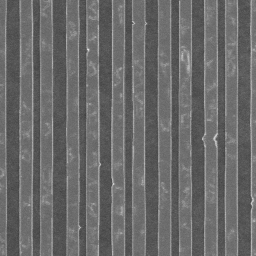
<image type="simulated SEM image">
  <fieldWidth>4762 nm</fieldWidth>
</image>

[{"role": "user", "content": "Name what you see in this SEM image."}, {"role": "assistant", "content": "parallel lines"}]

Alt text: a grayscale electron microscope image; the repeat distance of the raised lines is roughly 424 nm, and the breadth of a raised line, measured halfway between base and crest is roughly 228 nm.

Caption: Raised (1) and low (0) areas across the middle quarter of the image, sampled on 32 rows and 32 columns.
01110011100011100111000011100111
01110011100011100111000011100111
01110011100011100111000011100111
01110011100011100111000011100111
01110011100011100111000011100111
01110011100011100111000011100111
01110011100011100111000011100111
01110011100011100111000011100111
01110011100011100111000011100111
01110011100011100111000011100111
01110011100011100111000011100111
01110011100011100011000011100111
01110011100011100011000011100111
01110011100011100011000011100111
01110011100011100011000011100111
01110011100011100011000011100111
01110011100011100011000011100111
01110011100011100011000011100111
01110011100011100111000011100110
01110011100011100111000011100111
01110011100011100111000011100111
01110011100011100111000011100111
01110011100011100111000011100111
01110011100011100111000011100111
01110011100011100111000011100111
01110011100011100111000011100111
01110011100011100111000011100111
01110011100011100111000011100111
01110011100011100111000011100111
01110011100011100111000011100111
01110011100011100111000011100111
01110011100011100111000011100111